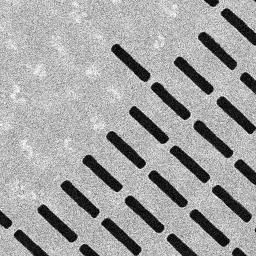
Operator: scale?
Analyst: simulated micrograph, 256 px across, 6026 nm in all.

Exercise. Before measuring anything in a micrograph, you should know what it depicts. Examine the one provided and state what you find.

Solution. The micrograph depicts a regular array of holes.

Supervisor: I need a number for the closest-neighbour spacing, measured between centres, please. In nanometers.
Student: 787